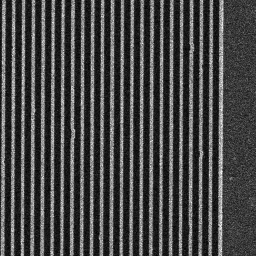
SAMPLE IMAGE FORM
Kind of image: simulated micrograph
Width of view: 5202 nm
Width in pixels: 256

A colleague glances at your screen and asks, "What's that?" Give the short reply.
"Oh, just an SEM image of parallel lines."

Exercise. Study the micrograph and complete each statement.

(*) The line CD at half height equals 71.1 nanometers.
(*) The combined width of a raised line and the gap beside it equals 201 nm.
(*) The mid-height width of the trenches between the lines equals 142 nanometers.